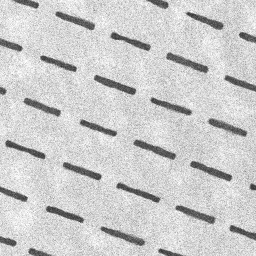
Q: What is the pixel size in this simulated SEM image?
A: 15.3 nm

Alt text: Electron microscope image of a regular array of holes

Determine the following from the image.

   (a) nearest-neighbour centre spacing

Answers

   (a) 0.705 µm